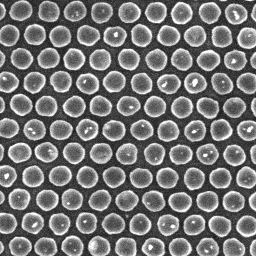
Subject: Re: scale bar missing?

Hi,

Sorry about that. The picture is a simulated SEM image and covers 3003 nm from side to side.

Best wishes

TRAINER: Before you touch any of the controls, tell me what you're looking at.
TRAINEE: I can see a regular array of raised bodies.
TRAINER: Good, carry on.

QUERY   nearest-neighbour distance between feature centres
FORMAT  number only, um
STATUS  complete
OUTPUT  0.306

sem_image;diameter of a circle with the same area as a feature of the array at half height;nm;246